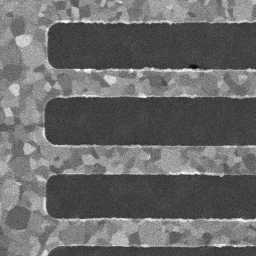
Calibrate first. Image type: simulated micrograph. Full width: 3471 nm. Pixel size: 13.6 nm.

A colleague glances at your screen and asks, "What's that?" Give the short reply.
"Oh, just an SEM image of one or a few lines or trenches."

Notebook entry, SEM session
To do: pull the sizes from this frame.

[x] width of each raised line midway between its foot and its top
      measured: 380 nm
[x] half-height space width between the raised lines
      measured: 632 nm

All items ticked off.